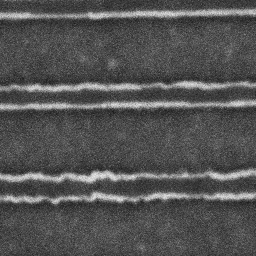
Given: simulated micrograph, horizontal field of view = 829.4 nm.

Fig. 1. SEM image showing one or a few lines or trenches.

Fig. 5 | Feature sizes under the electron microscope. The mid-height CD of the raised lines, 73.3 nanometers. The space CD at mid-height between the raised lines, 222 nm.